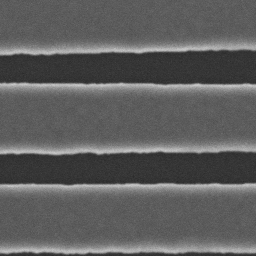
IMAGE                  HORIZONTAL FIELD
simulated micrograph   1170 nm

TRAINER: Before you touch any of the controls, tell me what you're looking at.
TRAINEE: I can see lines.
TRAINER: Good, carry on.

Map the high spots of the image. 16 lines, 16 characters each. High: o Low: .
oooooooooooooooo
oooooooooooooooo
oooooooooooooooo
................
................
oooooooooooooooo
oooooooooooooooo
oooooooooooooooo
oooooooooooooooo
oooooooooo......
................
................
oooooooooooooooo
oooooooooooooooo
oooooooooooooooo
oooooooooooooooo